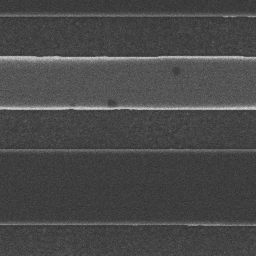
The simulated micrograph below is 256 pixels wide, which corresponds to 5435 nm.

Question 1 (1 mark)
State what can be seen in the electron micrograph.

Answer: lines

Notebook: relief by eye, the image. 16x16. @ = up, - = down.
@@@@@@@@@@@@@@@@
----------------
----------------
----------------
@@@@@@@@@@@@@@@@
@@@@@@@@@@@@@@@@
@@@@@@@@@@@@@@@@
----------------
----------------
@@@@@@@@@@@@@@@@
@@@@@@@@@@@@@@@@
@@@@@@@@@@@@@@@@
@@@@@@@@@@@@@@@@
@@@@@@@@@@@@@@@@
----------------
----------------